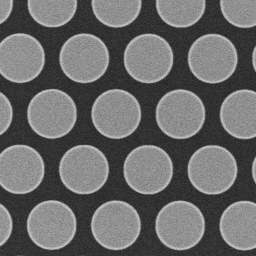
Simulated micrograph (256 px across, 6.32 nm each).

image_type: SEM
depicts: an array of small figures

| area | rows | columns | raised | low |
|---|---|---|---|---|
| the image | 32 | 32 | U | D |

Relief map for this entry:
UUDDUUUUUDDUUUUUUUDDUUUUUUDDUUUU
UDDDUUUUUDDDUUUUUDDDUUUUUDDDUUUU
UDDDUUUUUDDDUUUUUDDDUUUUUDDDUUUU
DDDDDDDDDDDDDDDDDDDDDDDDDDDDDDDD
DUUUDDDDDUUUDDDDDUUUDDDDDUUUDDDD
UUUUUDDDUUUUUDDDUUUUUDDDUUUUUDDD
UUUUUDDUUUUUUDDDUUUUUUDDUUUUUUDD
UUUUUDDUUUUUUUDDUUUUUUDDUUUUUUDD
UUUUUDDDUUUUUDDDUUUUUDDDUUUUUDDD
UUUUUDDDUUUUUDDDUUUUUDDDUUUUUDDD
DDDDDDDDDDDDDDDDDDDDDDDDDDDDDDDD
DDDDDUUUDDDDDUUUDDDDDUUUDDDDDUUU
UDDDUUUUUDDDUUUUUDDDUUUUUDDDUUUU
UDDUUUUUUDDDUUUUUDDDUUUUUUDDUUUU
UDDUUUUUUDDUUUUUUUDDUUUUUUDDUUUU
UDDDUUUUUDDDUUUUUDDDUUUUUDDDUUUU
UDDDUUUUUDDDUUUUUDDDUUUUUDDDUUUU
DDDDDDDDDDDDDDDDDDDDDDDDDDDDDDDD
DUUUDDDDDUUUDDDDDUUUDDDDDUUUDDDD
UUUUUDDDUUUUUDDDUUUUUDDDUUUUUDDD
UUUUUDDUUUUUUDDDUUUUUUDDUUUUUDDD
UUUUUDDUUUUUUUDDUUUUUUDDUUUUUUDD
UUUUUDDDUUUUUDDDUUUUUDDDUUUUUDDD
UUUUDDDDDUUUDDDDUUUUUDDDUUUUUDDD
DDDDDDDDDDDDDDDDDDDDDDDDDDDDDDDD
DDDDDUUUDDDDDUUUDDDDDUUUDDDDDUUU
UDDDUUUUUDDDUUUUUDDDUUUUUDDDUUUU
UDDUUUUUUDDUUUUUUUDDUUUUUDDDUUUU
UDDUUUUUUDDUUUUUUUDDUUUUUDDUUUUU
UDDDUUUUUDDDUUUUUDDDUUUUUDDDUUUU
DDDDDUUUDDDDUUUUDDDDUUUUUDDDDUUU
DDDDDDDDDDDDDDDDDDDDDDDDDDDDDDDD